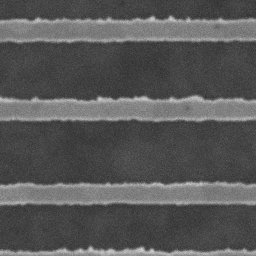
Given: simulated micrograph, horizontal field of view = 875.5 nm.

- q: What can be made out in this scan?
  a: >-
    lines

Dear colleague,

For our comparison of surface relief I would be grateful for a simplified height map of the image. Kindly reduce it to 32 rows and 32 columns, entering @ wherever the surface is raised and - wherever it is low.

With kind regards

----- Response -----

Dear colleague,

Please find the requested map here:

--------------------------------
--------------------------------
--------@--@-@---@@@-@---------@
@@@@@@@@@@@@@@@@@@@@@@@@@@@@@@@@
@@@@@@@@@@@@@@@@@@@@@@@@@@@@@@@@
--------------------------------
--------------------------------
--------------------------------
--------------------------------
--------------------------------
--------------------------------
--------------------------------
@@@-@-@@@---@@@@@@@@@@@@@@-@@@--
@@@@@@@@@@@@@@@@@@@@@@@@@@@@@@@@
@@@@@@@@@@@@@@@@@@@@@@@@@@@@@@@@
--------------------------------
--------------------------------
--------------------------------
--------------------------------
--------------------------------
--------------------------------
--------------------------------
--------------------------------
@@@@@@@@@@@@@@@@@@@@@@@@@@@@@@@@
@@@@@@@@@@@@@@@@@@@@@@@@@@@@@@@@
@@@----@@@@@-@------@-@@---@@-@@
--------------------------------
--------------------------------
--------------------------------
--------------------------------
--------------------------------
@@-----@@@@@@@@@@@@@--@@@--@@@@@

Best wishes